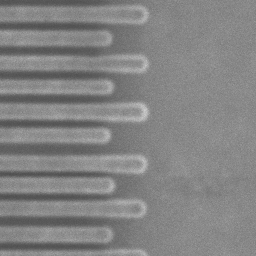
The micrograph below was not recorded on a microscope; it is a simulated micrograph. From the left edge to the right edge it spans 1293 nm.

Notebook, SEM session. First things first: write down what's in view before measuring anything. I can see parallel lines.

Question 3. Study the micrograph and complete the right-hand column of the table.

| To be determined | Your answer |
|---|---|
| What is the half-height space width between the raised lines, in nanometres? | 44.8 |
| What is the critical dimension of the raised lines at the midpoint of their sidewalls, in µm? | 0.0763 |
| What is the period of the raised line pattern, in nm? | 124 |